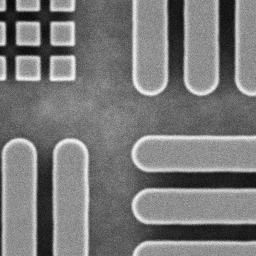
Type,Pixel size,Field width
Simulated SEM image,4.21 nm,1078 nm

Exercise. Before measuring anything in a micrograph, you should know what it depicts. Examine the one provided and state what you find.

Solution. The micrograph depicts groups of lines, slits or small figures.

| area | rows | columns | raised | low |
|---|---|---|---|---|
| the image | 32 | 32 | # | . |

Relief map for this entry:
#.###.###........####..####...##
.................####..####...##
.................####..####...##
#.###.###........####..####..###
#.###.###........####..####..###
..###..##........####..####...##
.................####..####...##
#.###.###........####..####...##
#.###.###........####..####...##
#.###.###........####..####...##
.................####..####...##
..................##....##....##
................................
................................
................................
................................
................................
..#.....#.........##############
.###...####......###############
####...####......###############
####...####......###############
####...####.....................
####...####.....................
####...####.....................
####...####......###############
####...####......###############
####...####......###############
####...####......###############
####...####.....................
####...####.....................
####...####.......##############
####...####......###############